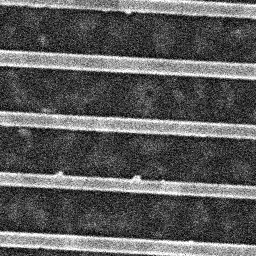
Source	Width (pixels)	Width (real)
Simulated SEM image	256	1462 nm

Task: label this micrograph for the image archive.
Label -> parallel lines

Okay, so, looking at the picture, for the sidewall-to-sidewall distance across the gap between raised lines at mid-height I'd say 269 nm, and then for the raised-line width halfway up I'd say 75.6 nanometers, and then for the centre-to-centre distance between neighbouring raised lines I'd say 344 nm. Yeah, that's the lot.